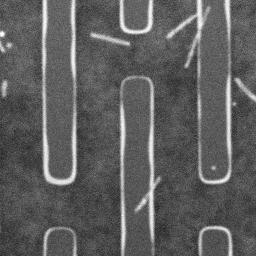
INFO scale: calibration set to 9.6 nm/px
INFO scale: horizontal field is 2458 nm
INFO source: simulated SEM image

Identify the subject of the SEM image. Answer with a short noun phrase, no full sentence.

groups of lines, slits or small figures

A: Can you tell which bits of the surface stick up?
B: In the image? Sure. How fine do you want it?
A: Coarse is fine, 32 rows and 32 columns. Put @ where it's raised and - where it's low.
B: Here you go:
------@@@------@@@@------@@@----
------@@@------@@@@------@@@@---
------@@@------@@@@------@@@@---
------@@@------@@@@------@@@@---
-----@@@@----------------@@@@---
-----@@@@----------------@@@@---
-----@@@@----------------@@@@---
-----@@@@----------------@@@@---
-----@@@@----------------@@@@---
-----@@@@----------------@@@@---
-----@@@@------@@@@------@@@@---
-----@@@@------@@@@------@@@@---
------@@@------@@@@------@@@@---
------@@@------@@@@------@@@@---
------@@@------@@@@------@@@@---
------@@@------@@@@------@@@@---
------@@@------@@@@------@@@@---
------@@@------@@@@------@@@@---
------@@@------@@@@------@@@@---
------@@@------@@@@------@@@@---
------@@@------@@@@------@@@@---
------@@@------@@@@------@@@@---
------@@@------@@@@------@@@----
---------------@@@@-------------
---------------@@@@-------------
---------------@@@@-------------
---------------@@@@-------------
---------------@@@@-------------
-------@-------@@@@-------@@----
------@@@------@@@@------@@@@---
------@@@------@@@@------@@@@---
------@@@------@@@@------@@@@---